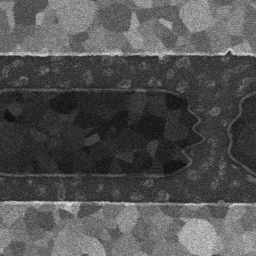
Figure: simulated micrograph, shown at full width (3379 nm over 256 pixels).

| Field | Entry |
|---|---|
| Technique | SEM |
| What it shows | one or a few lines or trenches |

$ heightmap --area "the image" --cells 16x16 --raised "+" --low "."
++++++++++++++++
++++++++++++++++
++++++++++++++++
................
................
................
++++++++++++...+
++++++++++++...+
++++++++++++..++
++++++++++++..++
+++++++++++....+
................
................
++++++++++++++++
++++++++++++++++
++++++++++++++++